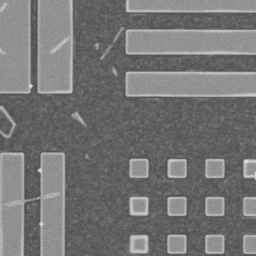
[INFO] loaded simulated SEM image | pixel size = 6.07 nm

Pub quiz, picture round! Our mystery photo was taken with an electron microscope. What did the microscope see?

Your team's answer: groups of lines, slits or small figures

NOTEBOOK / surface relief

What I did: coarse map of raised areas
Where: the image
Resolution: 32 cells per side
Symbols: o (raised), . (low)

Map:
oooo.oooo.......oooooooooooooooo
oooo.oooo.............oooo....oo
oooo.oooo.......................
oooo.oooo.......................
oooo.oooo.......oooooooooooooooo
oooo.oooo.......oooooooooooooooo
oooo.oooo.......oooooooooooooooo
oooo.oooo.......................
oooo.oooo.......................
oooo.oooo.......oooooooooooooooo
oooo.oooo.......oooooooooooooooo
ooo..ooo........oooooooooooooooo
................................
................................
o...............................
oo..............................
oo..............................
................................
................................
ooo..ooo........................
ooo..ooo........oo...oo...oo...o
ooo..ooo........oo...oo...oo...o
ooo..ooo........................
ooo..ooo........................
ooo..ooo........................
ooo..ooo........oo...oo...oo..oo
ooo..ooo.........o...oo...oo..oo
ooo..ooo........................
ooo..ooo........................
ooo..ooo.............oo...oo...o
ooo..ooo........oo...oo...oo..oo
ooo..ooo.............oo...oo...o